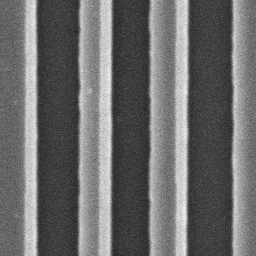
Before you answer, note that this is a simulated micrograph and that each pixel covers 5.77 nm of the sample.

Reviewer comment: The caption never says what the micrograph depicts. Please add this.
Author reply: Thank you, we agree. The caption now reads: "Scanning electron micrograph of lines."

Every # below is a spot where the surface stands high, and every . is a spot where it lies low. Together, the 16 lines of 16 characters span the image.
##...##..###...#
##...##..###...#
##...##...##...#
##...##..###...#
##...##...##...#
##...##..###...#
##...##...##...#
##...##...##...#
##...##...##...#
##...##...##...#
##...##..###...#
##...##..###...#
##...##..###...#
##...##..###...#
##...##..###...#
##...##..###...#